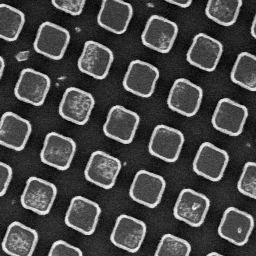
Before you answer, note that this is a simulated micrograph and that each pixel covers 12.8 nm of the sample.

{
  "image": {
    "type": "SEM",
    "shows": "a regular array of raised bodies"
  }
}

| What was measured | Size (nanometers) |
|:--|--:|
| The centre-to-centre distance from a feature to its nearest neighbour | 614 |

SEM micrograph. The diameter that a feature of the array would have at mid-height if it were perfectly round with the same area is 418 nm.